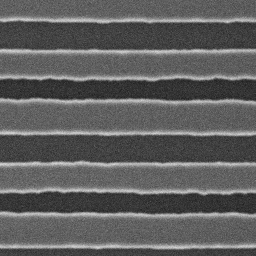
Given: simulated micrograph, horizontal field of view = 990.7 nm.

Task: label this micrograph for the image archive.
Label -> lines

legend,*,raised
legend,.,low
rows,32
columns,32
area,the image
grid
********************************
********************************
**.*****************************
................................
................................
................................
********************************
********************************
********************************
********************************
................................
................................
**.****....*.*..***.............
********************************
********************************
********************************
********************************
................................
................................
................................
*************.******************
********************************
********************************
********************************
................................
................................
................................
********************************
********************************
********************************
********************************
................................